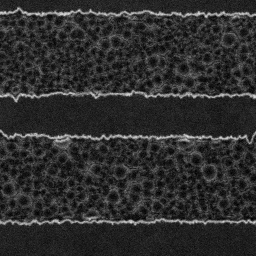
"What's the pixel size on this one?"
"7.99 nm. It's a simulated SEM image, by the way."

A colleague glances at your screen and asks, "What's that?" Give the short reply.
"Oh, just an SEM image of one or a few lines or trenches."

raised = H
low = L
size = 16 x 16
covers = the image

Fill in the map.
LLLLLLLLLLLLLLLL
HHHHHHHHHHHHHHHH
HHHHHHHHHHHHHHHH
HHHHHHHHHHHHHHHH
HHHHHHHHHHHHHHHH
HHHHHHHHHHHHHHHH
LLLLLLLLLLLLLLLL
LLLLLLLLLLLLLLLL
LLLLLLLLLLLLLLLL
HHHHHHHHHHHHHHHH
HHHHHLHHHHHHHHHH
HHHHHHHHHHHHHHHH
HHHHHHHHHHHHHHHH
HHHHHHHHHHHHHHHH
LLLLLLLLLLLLLLLL
LLLLLLLLLLLLLLLL